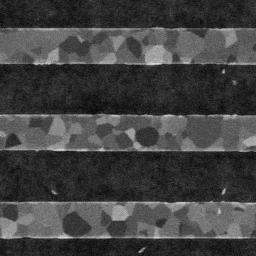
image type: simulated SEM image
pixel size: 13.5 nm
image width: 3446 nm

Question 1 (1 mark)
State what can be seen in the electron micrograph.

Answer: lines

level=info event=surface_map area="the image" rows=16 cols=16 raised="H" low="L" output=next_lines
LLLLLLLLLLLLLLLL
LLLLLLLLLLLLLLLL
HHHHHHHHHHHHHHHH
HHHHHHHHHHHHHHHH
LLLLLLLLLLLLLLLL
LLLLLLLLLLLLLLLL
LLLLLLLLLLLLLLLL
HHHHHHHHHHHHHHHH
HHHHHHHHHHHHHHHH
LLLLLLLLLLLLLLLL
LLLLLLLLLLLLLLLL
LLLLLLLLLLLLLLLL
LLLLLLLLLLLLLLLL
HHHHHHHHHHHHHHHH
HHHHHHHHHHHHHHHH
LLLLLLLLLLLLLLLL